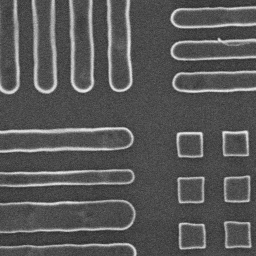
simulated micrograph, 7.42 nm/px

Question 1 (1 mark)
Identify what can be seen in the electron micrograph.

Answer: groups of lines, slits or small figures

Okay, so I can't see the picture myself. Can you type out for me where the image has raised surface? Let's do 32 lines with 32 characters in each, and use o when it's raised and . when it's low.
oo..ooo..oo...oo................
oo..ooo..oo...oo......oooooooooo
oo..ooo..oo...oo......oooooooooo
oo..ooo..oo...oo................
oo..ooo..oo...oo................
oo..ooo..ooo..oo......oooooooooo
oo..ooo..ooo..oo......oooooooooo
oo..ooo..ooo..oo................
oo..ooo..ooo..oo................
oo..ooo..ooo..oo......oooooooooo
oo..ooo..ooo..oo......oooooooooo
................................
................................
................................
................................
................................
.ooooooooooooooo................
ooooooooooooooooo.....ooo...ooo.
oooooooooooooooo......ooo...ooo.
.......................oo.......
................................
.........ooooooo................
ooooooooooooooooo.....ooo...ooo.
......................ooo...ooo.
......................ooo...ooo.
oooooooooooooooo................
ooooooooooooooooo...............
ooooooooooooooooo...............
oooooooooooooooo......oooo..ooo.
......................oooo..ooo.
......................oooo..ooo.
ooooooooooooooooo...............